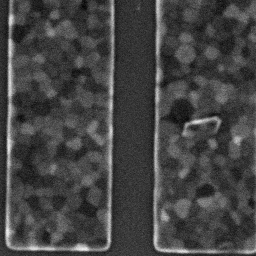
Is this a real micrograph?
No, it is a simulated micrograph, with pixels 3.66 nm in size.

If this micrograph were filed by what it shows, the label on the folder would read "wiring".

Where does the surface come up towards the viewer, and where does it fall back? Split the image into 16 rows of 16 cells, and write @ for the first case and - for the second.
-@@@@@@---@@@@@@
-@@@@@@---@@@@@@
-@@@@@@---@@@@@@
-@@@@@@---@@@@@@
-@@@@@@---@@@@@@
-@@@@@@---@@@@@@
-@@@@@@---@@@@@@
@@@@@@@---@@@@@@
@@@@@@@---@@@@@@
@@@@@@@---@@@@@@
@@@@@@@---@@@@@@
@@@@@@@---@@@@@@
@@@@@@@---@@@@@@
@@@@@@@---@@@@@@
@@@@@@@---@@@@@@
-@@@@@@---@@@@@@